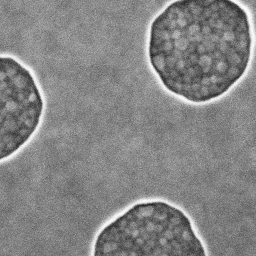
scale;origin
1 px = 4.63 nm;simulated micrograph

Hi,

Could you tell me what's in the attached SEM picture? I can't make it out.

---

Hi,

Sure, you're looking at holes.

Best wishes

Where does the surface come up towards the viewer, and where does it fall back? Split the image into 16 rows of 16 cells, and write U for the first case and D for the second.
UUUUUUUUUUDDDDDU
UUUUUUUUUUDDDDDD
UUUUUUUUUDDDDDDD
UUUUUUUUUDDDDDDD
DDUUUUUUUUDDDDDU
DDUUUUUUUUDDDDUU
DDDUUUUUUUUUUUUU
DDUUUUUUUUUUUUUU
DDUUUUUUUUUUUUUU
DUUUUUUUUUUUUUUU
UUUUUUUUUUUUUUUU
UUUUUUUUUUUUUUUU
UUUUUUUUUUUUUUUU
UUUUUUUUDDDDUUUU
UUUUUUDDDDDDUUUU
UUUUUUDDDDDDDUUU